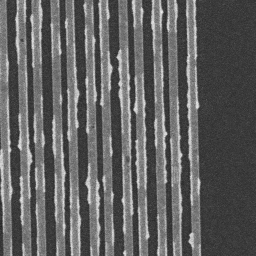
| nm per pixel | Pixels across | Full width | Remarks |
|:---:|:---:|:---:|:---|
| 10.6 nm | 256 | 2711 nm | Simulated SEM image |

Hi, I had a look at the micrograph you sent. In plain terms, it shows parallel lines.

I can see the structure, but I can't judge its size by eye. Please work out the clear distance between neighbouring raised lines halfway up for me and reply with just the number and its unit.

92.6 nm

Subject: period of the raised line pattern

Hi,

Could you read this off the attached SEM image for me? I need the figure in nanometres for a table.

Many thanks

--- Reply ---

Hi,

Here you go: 180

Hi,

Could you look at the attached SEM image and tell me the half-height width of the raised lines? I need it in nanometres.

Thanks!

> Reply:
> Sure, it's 94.